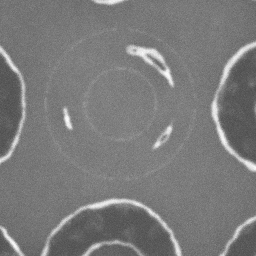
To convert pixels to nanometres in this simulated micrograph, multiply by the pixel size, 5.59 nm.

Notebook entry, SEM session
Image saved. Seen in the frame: ring-shaped raised bodies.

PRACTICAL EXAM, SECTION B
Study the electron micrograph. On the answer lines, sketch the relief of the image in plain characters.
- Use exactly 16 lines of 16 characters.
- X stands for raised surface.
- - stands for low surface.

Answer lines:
----------------
----------------
----------------
---------X-----X
X-------------XX
XX------------XX
XX-----------XXX
X-------------XX
X-------------XX
X-------------XX
----------------
----------------
----------------
----XXXXXX------
---XXXXXXXX----X
X--XXX--XXX---XX